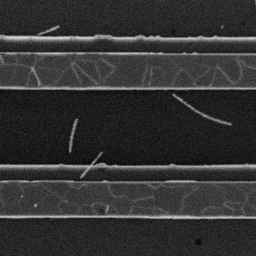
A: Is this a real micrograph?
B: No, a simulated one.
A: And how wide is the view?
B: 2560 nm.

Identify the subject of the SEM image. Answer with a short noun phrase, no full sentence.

lines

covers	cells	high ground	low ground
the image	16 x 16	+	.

................
................
++++++++++++++++
++++++++++++++++
++++++++++++++++
............+..+
................
................
................
................
++++++++++++++++
++++++++++++++++
++++++++++++++++
.......+++++++++
................
................